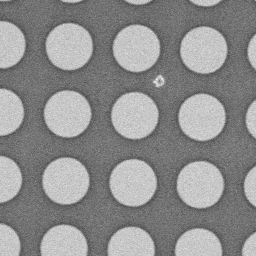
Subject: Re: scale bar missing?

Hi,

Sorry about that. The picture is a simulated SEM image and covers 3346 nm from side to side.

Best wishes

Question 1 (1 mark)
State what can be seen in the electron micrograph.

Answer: an array of small figures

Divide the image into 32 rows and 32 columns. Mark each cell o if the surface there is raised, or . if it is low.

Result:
.................o.......oo.....
................................
................................
oo.....ooo......oo.......o......
ooo...ooooo....ooooo...ooooo....
ooo...ooooo...oooooo...ooooo...o
ooo...ooooo...oooooo...ooooo...o
oo....ooooo....ooooo...ooooo...o
........oo......ooo.....ooo.....
................................
................................
o......oo.......................
oo....ooooo....oooo....oooo.....
ooo...ooooo...oooooo...ooooo...o
ooo...ooooo...oooooo..oooooo...o
ooo...ooooo...oooooo..oooooo...o
oo.....ooo.....oooo....oooo....o
.........................o......
................................
................................
oo....oooo.....ooo......oo......
ooo...ooooo...ooooo....oooo....o
ooo..oooooo...ooooo...oooooo...o
oo...oooooo...ooooo...oooooo...o
oo....oooo....ooooo....ooooo...o
...............ooo.....oooo.....
................................
................................
o......oo.......o...............
oo....oooo....ooooo....oooo....o
oo...oooooo...ooooo...oooooo...o
oo...oooooo...ooooo...oooooo..oo